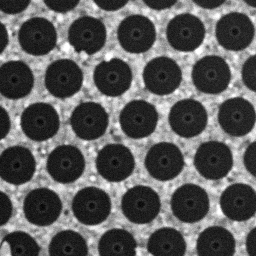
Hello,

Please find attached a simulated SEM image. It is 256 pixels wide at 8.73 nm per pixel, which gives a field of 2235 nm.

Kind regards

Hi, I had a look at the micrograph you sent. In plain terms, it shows an array of small figures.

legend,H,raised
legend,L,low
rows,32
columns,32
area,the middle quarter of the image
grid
LLLLHHHHLLLLLLLLHHHHLLLLLLLLLHHH
LLLLLHHLLLLLLLLLLHHHLLLLLLLLLHHH
LLLLLHHLLLLHHLLLLHHLLLLHHHLLLLHH
HLLLLHHLLLLHHLLLLHHHLLLHHHLLLLHH
HLLLLHHLLLLLLLLLLHHHLLLLLLLLLHHH
LLLLLHHHLLLLLLLLLHHHLLLLLLLLLHHH
LLLLHHHHLLLLLLLLHHHHHLLLLLLLHHHH
LLLHHHHHHLLLLLLHHHHHHHLLLLLHHHHH
LHHHHHHHHHHHLHHHHHHHHHHHHHHHHHHH
HHHHHLLLHHHHHHHHLLLLLHHHHHHHLLLL
HHHLLLLLLLHHHHHLLLLLLLHHHHHLLLLL
HHLLLLLLLLHHHHLLLLLLLLLHHHLLLLLL
HHLLLLLLLLLHHHLLLLLLLLLLHHLLLLLL
HLLLLHHLLLLHHHLLLLHHLLLLHHLLLLHH
HLLLLHHLLLLHHHLLLLHHLLLLHHLLLLHH
HHLLLLLLLLLHHHLLLLLLLLLHHHLLLLLL
HHLLLLLLLLLHHHLLLLLLLLLHHHHLLLLL
HHHLLLLLLLHHHHHLLLLLLLHHHHHHLLLL
HHHHLLLLLHHHHHHHHLLLHHHHHHHHHHLL
HHHHHHHHHHHHHHHHHHHHHHHHLLHHHHHH
LLLHHHHHHHLLLLLLHHHHHHLLLLLLHHHH
LLLLHHHHHLLLLLLLLHHHHLLLLLLLLHHH
LLLLLHHHLLLLLLLLLHHHLLLLLLLLLLHH
LLLLLHHHLLLLLLLLLLHHLLLLHHLLLLHH
HLLLLHHHLLLLHHLLLLHHLLLLHHLLLLHH
HLLLLHHHLLLLHHLLLLHHLLLLLLLLLLHH
LLLLLHHHLLLLLLLLLHHHLLLLLLLLLLHH
LLLLLHHHHLLLLLLLLHHHHLLLLLLLLHHH
LLLLHHHHHHLLLLLLHHHHHHLLLLLLHHHH
LLLHHHHHHHHLLLHHHHHHHHHHHHHHHHHH
HHHHHHLLHHHHHHHHHLLLLHHHHHHHHLLL
HHHHLLLLHLHHHHHHLLLLLLLHHHHHLLLL